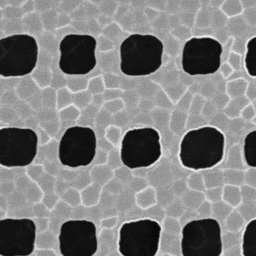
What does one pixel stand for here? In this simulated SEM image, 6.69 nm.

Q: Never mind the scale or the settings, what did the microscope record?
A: holes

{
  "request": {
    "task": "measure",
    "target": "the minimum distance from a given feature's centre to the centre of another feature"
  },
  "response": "412 nm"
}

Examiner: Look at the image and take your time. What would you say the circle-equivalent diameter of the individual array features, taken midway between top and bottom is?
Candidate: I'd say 272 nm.